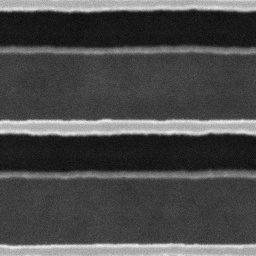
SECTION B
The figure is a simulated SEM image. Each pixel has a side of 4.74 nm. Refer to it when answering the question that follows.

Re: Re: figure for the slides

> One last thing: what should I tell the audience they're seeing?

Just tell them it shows lines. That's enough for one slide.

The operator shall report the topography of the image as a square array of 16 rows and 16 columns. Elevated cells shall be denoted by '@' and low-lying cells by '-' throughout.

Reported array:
@@@@@@@@@@@@@@@@
----------------
----------------
@@@@@@@@@@@@@@@@
@@@@@@@@@@@@@@@@
@@@@@@@@@@@@@@@@
@@@@@@@@@@@@@@@@
@@@@@@@@@@@@@@@@
----------------
----------------
----------------
@@@@@@@@@@@@@@@@
@@@@@@@@@@@@@@@@
@@@@@@@@@@@@@@@@
@@@@@@@@@@@@@@@@
@@@@@@@@@@@@@@@@